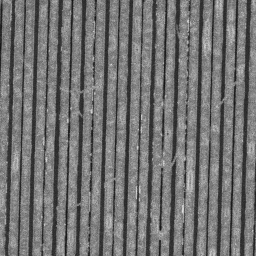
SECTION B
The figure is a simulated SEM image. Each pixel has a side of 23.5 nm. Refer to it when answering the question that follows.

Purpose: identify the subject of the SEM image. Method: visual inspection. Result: parallel lines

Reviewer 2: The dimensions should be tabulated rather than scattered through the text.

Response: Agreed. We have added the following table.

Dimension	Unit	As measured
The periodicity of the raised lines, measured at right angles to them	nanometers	276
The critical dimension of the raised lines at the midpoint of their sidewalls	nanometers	197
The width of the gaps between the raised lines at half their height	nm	88.1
